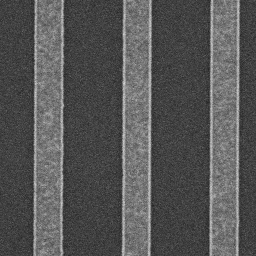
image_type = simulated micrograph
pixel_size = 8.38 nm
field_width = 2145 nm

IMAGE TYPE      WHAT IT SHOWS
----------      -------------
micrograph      one or a few lines or trenches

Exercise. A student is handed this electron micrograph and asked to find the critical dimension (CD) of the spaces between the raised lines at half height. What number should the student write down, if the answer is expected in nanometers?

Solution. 514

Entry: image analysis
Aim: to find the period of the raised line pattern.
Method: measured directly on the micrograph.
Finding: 737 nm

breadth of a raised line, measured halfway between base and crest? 228 nanometers